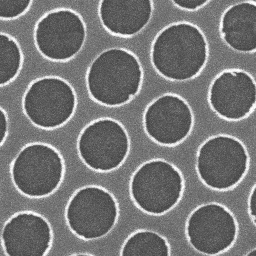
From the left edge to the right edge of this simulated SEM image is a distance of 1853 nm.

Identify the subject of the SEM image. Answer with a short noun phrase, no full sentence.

a regular array of holes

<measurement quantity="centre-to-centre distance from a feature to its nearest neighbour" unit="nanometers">494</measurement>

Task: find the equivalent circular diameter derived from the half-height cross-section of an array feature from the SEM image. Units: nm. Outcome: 360